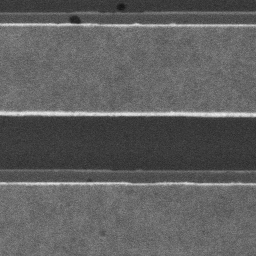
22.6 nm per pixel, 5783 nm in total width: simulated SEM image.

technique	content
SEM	lines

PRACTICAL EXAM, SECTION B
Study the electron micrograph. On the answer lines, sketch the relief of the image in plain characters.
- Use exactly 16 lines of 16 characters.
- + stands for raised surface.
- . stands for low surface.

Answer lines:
................
................
++++++++++++++++
++++++++++++++++
++++++++++++++++
++++++++++++++++
++++++++++++++++
................
................
................
................
+++++++++++++.++
++++++++++++++++
++++++++++++++++
++++++++++++++++
++++++++++++++++